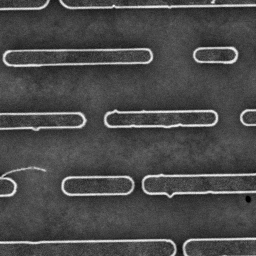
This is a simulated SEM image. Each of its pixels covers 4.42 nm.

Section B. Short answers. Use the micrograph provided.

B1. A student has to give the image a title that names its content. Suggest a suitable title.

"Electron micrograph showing one or a few lines or trenches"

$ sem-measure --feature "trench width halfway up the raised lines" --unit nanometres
209